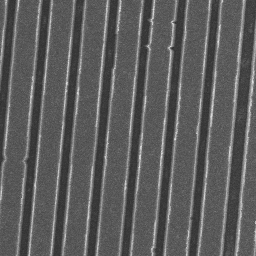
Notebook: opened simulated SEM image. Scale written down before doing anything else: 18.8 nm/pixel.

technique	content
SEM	parallel lines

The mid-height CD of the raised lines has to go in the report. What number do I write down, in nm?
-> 457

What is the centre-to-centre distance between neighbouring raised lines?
636 nm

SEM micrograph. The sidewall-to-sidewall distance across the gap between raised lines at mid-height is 0.185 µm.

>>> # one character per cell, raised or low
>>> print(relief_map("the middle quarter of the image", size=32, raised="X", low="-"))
X---XXXXXX---XXXXX---XXXXXX--XXX
X---XXXXXX--XXXXXX---XXXXXX--XXX
X---XXXXX---XXXXXX---XXXXXX--XXX
X--XXXXXX---XXXXXX---XXXXX---XXX
X--XXXXXX---XXXXXX---XXXXX---XXX
X--XXXXXX---XXXXXX--XXXXXX---XXX
X--XXXXXX---XXXXXX--XXXXXX---XXX
X--XXXXXX---XXXXXX--XXXXXX---XXX
X--XXXXXX---XXXXXX--XXXXXX---XXX
---XXXXXX--XXXXXX---XXXXXX--XXXX
---XXXXXX--XXXXXX---XXXXXX--XXXX
---XXXXXX--XXXXXX---XXXXXX--XXXX
---XXXXXX--XXXXXX---XXXXXX--XXXX
---XXXXX---XXXXXX---XXXXXX--XXXX
--XXXXXX---XXXXXX---XXXXXX--XXXX
--XXXXXX---XXXXXX---XXXXX---XXXX
--XXXXXX---XXXXXX--XXXXXX---XXXX
--XXXXXX---XXXXXX--XXXXXX---XXXX
--XXXXXX---XXXXXX--XXXXXX---XXXX
--XXXXXX---XXXXXX--XXXXXX---XXXX
--XXXXXX--XXXXXXX--XXXXXX--XXXXX
--XXXXXX--XXXXXX---XXXXXX--XXXXX
--XXXXXX--XXXXXX---XXXXXX--XXXXX
--XXXXXX--XXXXXX---XXXXXX--XXXXX
--XXXXX---XXXXXX---XXXXX---XXXXX
--XXXXX---XXXXXX---XXXXXX--XXXXX
--XXXXX---XXXXXX---XXXXX---XXXXX
-XXXXXX---XXXXXX--XXXXXX---XXXXX
-XXXXXX---XXXXXX--XXXXXX---XXXXX
-XXXXXX---XXXXXX--XXXXXX---XXXXX
-XXXXXX---XXXXXX--XXXXXX---XXXXX
-XXXXXX--XXXXXX---XXXXXX--XXXXXX